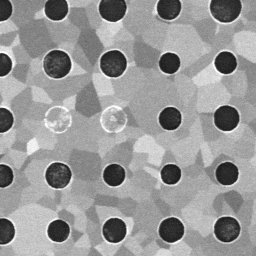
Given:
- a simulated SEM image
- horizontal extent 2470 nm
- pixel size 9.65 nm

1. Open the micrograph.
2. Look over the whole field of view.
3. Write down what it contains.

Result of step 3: a regular array of holes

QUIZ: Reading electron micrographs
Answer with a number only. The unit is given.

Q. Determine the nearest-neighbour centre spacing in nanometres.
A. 536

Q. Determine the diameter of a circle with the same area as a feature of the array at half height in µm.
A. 0.237